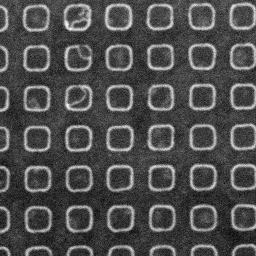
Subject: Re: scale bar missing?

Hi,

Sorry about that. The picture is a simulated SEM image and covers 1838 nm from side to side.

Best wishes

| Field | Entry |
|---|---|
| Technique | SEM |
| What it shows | a regular array of raised bodies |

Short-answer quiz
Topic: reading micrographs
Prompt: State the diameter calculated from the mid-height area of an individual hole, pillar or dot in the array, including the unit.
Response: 190 nm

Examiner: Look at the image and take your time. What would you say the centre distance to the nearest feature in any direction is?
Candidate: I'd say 288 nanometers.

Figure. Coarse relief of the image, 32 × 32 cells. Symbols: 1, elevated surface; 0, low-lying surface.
00000000000000000000000000000000
10011100110001110001110011100111
10011100111001110011110011100111
10011100011000110001100000000010
00000000000000000000000000000000
00000000000000000000000000000000
10011100110001110001110011100111
10011100111001110001110011100111
10011100011000110001100011000010
00000000000000000000000000000000
00000000000000000000000000000000
10011100111001110001110011100111
10011100111000110001110011100111
10011100011000110001100011000010
00000000000000000000000000000000
00000000000000000000000000000000
10011100111000111001110011100111
10011100111000111001110011100111
10011100011000110001100011000010
00000000000000000000000000000000
00000000000000000000000000000000
10011100111000110001110011100111
10011100111000110001110011100111
10011100011000110001100011000010
00000000000000000000000000000000
00000000000000000000000000000000
10011100011000111001110011100111
10011100011000111001110011100111
10011100011000110001100011100010
00000000000000000000000000000000
00000000000000000000000000000000
10011100011000111001110011100111